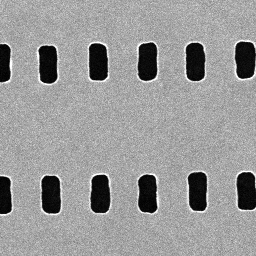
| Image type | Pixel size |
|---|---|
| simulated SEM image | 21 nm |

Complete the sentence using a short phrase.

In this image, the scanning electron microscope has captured a regular array of holes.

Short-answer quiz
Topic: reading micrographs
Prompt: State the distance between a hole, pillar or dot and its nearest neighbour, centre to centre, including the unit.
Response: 1.02 µm